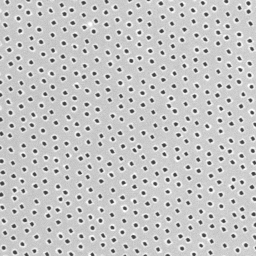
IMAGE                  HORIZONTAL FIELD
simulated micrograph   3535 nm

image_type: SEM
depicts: a regular array of holes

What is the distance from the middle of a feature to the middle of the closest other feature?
0.146 micrometres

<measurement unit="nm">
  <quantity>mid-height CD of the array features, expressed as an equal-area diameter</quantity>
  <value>62.3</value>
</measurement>